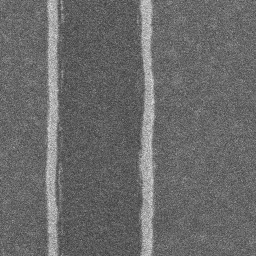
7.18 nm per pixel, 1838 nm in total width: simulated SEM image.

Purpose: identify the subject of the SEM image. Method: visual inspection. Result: one or a few lines or trenches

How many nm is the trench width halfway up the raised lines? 685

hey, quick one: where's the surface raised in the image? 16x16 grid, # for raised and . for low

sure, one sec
###......#######
###......#######
###......#######
###......#######
###......#######
###......#######
###......#######
###......#######
###......#######
###......#######
###......#######
###......#######
###......#######
###......#######
###......#######
###......#######